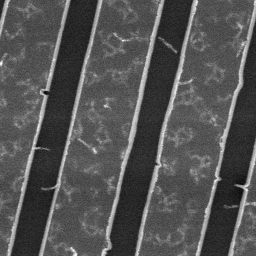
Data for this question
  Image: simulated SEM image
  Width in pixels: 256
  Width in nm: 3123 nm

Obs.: one or a few lines or trenches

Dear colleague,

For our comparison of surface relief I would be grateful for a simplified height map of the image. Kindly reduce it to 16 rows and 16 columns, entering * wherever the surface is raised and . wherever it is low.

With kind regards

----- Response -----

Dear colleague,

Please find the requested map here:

****..****..****
****..****..****
****..****..****
***..****..****.
***..****..****.
***..****..****.
***..****..****.
***..***..****..
**..****..****..
**..****..****..
**..****..****..
**..****..***..*
*..****..****..*
*..****..****..*
*..****..****..*
*..****..***..**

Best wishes